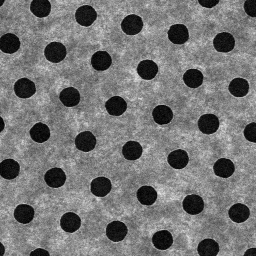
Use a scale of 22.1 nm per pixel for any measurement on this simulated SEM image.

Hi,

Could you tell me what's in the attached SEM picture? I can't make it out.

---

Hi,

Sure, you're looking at a regular array of holes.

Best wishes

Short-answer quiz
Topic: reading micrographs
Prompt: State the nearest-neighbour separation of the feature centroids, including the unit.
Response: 1030 nm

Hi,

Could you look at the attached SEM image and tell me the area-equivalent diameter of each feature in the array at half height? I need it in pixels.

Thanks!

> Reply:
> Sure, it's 20.9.